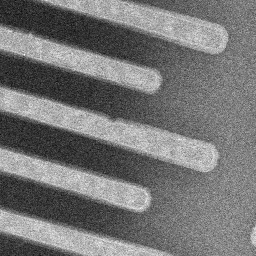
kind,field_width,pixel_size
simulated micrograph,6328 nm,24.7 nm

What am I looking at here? parallel lines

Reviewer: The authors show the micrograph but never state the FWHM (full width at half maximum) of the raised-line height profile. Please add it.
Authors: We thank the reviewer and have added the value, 591 nm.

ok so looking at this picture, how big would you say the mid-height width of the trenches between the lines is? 843 nm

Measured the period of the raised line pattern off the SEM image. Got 1440 nm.